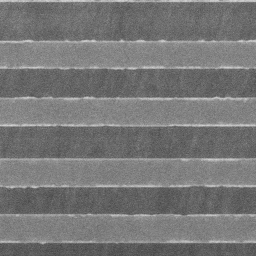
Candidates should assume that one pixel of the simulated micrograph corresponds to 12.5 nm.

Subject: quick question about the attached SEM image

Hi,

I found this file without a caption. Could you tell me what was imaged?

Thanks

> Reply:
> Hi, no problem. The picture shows lines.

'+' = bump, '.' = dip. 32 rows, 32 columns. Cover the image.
................................
................................
................................
................................
................................
++++++++++++++++++++++++++++++++
++++++++++++++++++++++++++++++++
++++++++++++++++++++++++++++++++
................+...............
................................
................................
................................
++++++++++++++++++++++++++++++++
++++++++++++++++++++++++++++++++
++++++++++++++++++++++++++++++++
++++++++++++++++++++++++++++++++
................................
................................
................................
................................
++++++++++++++++++++++++++++++++
++++++++++++++++++++++++++++++++
++++++++++++++++++++++++++++++++
................................
................................
................................
................................
++++++++++++++++++++++++++++++++
++++++++++++++++++++++++++++++++
++++++++++++++++++++++++++++++++
................................
................................